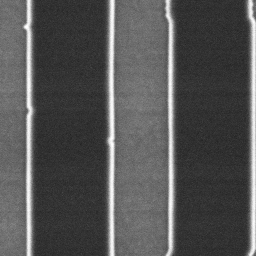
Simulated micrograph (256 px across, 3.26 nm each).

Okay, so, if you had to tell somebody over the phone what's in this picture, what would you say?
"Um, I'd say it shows one or a few lines or trenches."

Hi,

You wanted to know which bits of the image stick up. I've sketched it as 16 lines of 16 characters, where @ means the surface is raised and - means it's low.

--@@@@@---@@@@@@
--@@@@@----@@@@@
--@@@@@----@@@@@
--@@@@@----@@@@@
--@@@@@----@@@@@
--@@@@@----@@@@@
--@@@@@----@@@@@
--@@@@@----@@@@@
--@@@@@----@@@@@
--@@@@@----@@@@@
--@@@@@----@@@@@
--@@@@@----@@@@@
--@@@@@----@@@@@
--@@@@@----@@@@@
--@@@@@----@@@@@
--@@@@@----@@@@@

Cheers